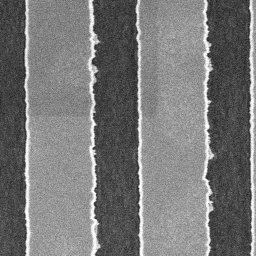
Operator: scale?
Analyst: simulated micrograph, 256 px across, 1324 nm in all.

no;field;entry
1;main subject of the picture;lines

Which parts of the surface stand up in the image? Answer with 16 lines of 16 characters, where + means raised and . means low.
..++++...++++...
..++++...++++...
..++++...++++...
..++++...++++...
..++++...++++...
..++++...++++...
..++++...++++...
..++++...++++...
..++++...++++...
..++++...++++...
..++++...++++...
..++++...++++...
..++++...++++...
..++++...++++...
..++++...++++...
..++++...++++...